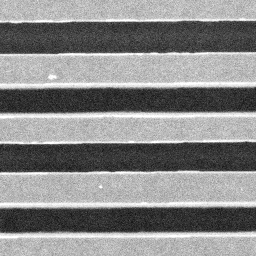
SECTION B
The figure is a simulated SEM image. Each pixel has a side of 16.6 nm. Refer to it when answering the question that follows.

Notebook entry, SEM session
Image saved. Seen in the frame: lines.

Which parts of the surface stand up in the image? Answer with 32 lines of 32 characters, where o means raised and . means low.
oooooooooooooooooooooooooooooooo
oooooooooooooooooooooooooooooooo
oooooooooooooooooooo............
................................
................................
................................
................................
oooooooooooooooooooooooooooooooo
oooooooooooooooooooooooooooooooo
oooooooooooooooooooooooooooooooo
ooooooooooooo..o................
................................
................................
................................
..............................oo
oooooooooooooooooooooooooooooooo
oooooooooooooooooooooooooooooooo
oooooooooooooooooooooooooooooooo
................................
................................
................................
................................
oooooooooooooooooooooooooooooooo
oooooooooooooooooooooooooooooooo
oooooooooooooooooooooooooooooooo
oooooooo........................
................................
................................
................................
..............................oo
oooooooooooooooooooooooooooooooo
oooooooooooooooooooooooooooooooo